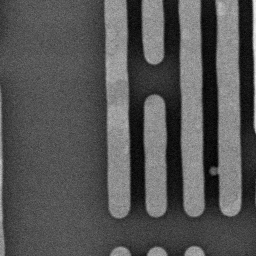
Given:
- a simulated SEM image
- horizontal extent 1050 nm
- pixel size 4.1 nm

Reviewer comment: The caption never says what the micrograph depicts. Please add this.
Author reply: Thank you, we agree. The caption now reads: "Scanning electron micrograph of groups of lines, slits or small figures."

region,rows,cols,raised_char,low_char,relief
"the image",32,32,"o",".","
.............ooo..oo..ooo..ooo..
.............ooo..oo..ooo..ooo..
.............ooo..oo..ooo..ooo..
.............ooo..oo...oo..ooo..
.............ooo..oo...oo..ooo..
.............ooo..oo...oo..ooo..
.............ooo..oo...oo..ooo..
.............ooo..oo...oo..ooo..
.............ooo.......oo..ooo..
.............ooo.......oo..ooo..
.............ooo.......oo..ooo..
.............ooo.......oo..ooo..
.............ooo..oo...oo..ooo..
..............oo..ooo..oo..ooo..
..............oo..ooo..oo..ooo..
..............oo..ooo..oo..ooo..
..............oo..ooo..oo..ooo..
..............oo..ooo..oo..ooo..
..............oo..ooo..oo..ooo..
..............oo..ooo..oo..ooo..
..............oo..ooo..oo..ooo..
..............oo..ooo..oo..ooo..
..............oo..ooo..oo..ooo..
..............oo..ooo..oo..ooo..
..............oo..ooo..oo..ooo..
..............oo..ooo..oo..ooo..
..............oo...oo..oo...oo..
................................
................................
................................
................................
..............oo...oo..oo.......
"